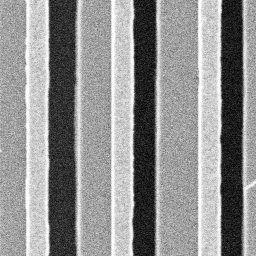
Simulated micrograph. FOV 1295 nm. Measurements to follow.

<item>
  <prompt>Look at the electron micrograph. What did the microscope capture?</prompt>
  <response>lines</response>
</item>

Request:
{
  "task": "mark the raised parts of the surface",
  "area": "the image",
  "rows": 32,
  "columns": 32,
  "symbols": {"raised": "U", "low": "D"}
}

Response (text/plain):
UUUUUUDDDDUUUUUUDDDDUUUUUUUUDDDU
UUUUUUDDDDUUUUUUUDDDUUUUUUUUDDUU
UUUUUUDDDDUUUUUUUDDDUUUUUUUDDDUU
UUUUUUDDDDUUUUUUDDDDUUUUUUUDDDDU
UUUUUUDDDDUUUUUUUDDDUUUUUUUDDDDU
UUUUUUDDDDUUUUUUUDDDUUUUUUUDDDDU
UUUUUUDDDDUUUUUUUDDDUUUUUUUDDDDU
UUUUUUDDDDUUUUUUUDDDUUUUUUUDDDDU
UUUUUUDDDDUUUUUUUDDDUUUUUUUDDDDU
UUUUUUDDDDUUUUUUUDDDUUUUUUUDDDDU
UUUUUUDDDDUUUUUUUDDDUUUUUUUDDDDU
UUUUUUDDDDUUUUUUUDDDUUUUUUUDDDDU
UUUUUUDDDDUUUUUUUDDDUUUUUUUUDDDU
UUUUUUDDDDUUUUUUUDDDUUUUUUUUDDDU
UUUUUUDDDDUUUUUUUDDDUUUUUUUDDDDU
UUUUUUDDDDUUUUUUUDDDUUUUUUUUDDDU
UUUUUUDDDDUUUUUUUDDDUUUUUUUDDDDU
UUUUUUDDDDUUUUUUDDDDUUUUUUUDDDDU
UUUUUUDDDDUUUUUUDDDDUUUUUUUDDDDU
UUUUUUDDDDUUUUUUUDDDUUUUUUUDDDDU
UUUUUUDDDDUUUUUUDDDDUUUUUUUDDDDU
UUUUUUDDDDUUUUUUUDDDUUUUUUUDDDDU
UUUUUUDDDDUUUUUUDDDDUUUUUUUDDDDU
UUUUUUDDDDUUUUUUDDDDUUUUUUUDDDDU
UUUUUUDDDDUUUUUUUDDDUUUUUUUDDDDU
UUUUUUDDDDUUUUUUUDDDUUUUUUUDDDDU
UUUUUUDDDDUUUUUUUDDDUUUUUUUDDDDU
UUUUUUDDDDUUUUUUDDDDUUUUUUUDDDDU
UUUUUUDDDDUUUUUUDDDDUUUUUUUDDDDU
UUUUUUDDDDUUUUUUDDDDUUUUUUUDDDDU
UUUUUUDDDDUUUUUUDDDDUUUUUUUDDDDU
UUUUUUDDDDUUUUUUDDDDUUUUUUUDDDDU